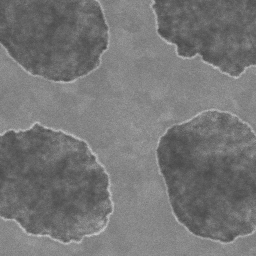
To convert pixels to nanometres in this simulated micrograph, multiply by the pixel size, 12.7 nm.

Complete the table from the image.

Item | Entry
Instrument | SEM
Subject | holes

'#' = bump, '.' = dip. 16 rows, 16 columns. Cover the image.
......####......
.......###......
.......###......
#.....#####.....
##....########.#
################
################
############...#
.....#####......
......####......
......####......
.......###......
.......####.....
.......####.....
##....######....
################